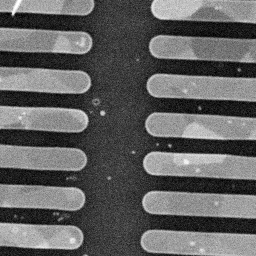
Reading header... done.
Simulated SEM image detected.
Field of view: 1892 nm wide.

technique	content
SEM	groups of lines, slits or small figures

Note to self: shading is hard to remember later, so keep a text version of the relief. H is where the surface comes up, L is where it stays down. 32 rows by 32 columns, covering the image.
HHHHHHHHHHHHLLLLLLLHHHHHHHHHHHHH
LHLLHHHHHHHLLLLLLLLHHHHHHHHHHHHH
LLLLLLLLLLLLLLLLLLLLLLLLHHHHHHHH
LLLLLLLLLLLLLLLLLLLLLLLLLLLLLLLL
HHHHHHHHHHHLLLLLLLLLLLLLLLLLLLLL
HHHHHHHHHHHLLLLLLLLHHHHHHHHHHHHH
LLLLLLLLHHHLLLLLLLLHHHHHHHHHHHHH
LLLLLLLLLLLLLLLLLLLLLLLLLLHHHHHH
HHLLLLLLLLLLLLLLLLLLLLLLLLLLLLLL
HHHHHHHHHHHLLLLLLLLHHHHLLLLLLLLL
HHHHHHHHHHHLLLLLLLHHHHHHHHHHHHHH
LLLLLLHHHHLLLLLLLLLHHHHHHHHHHHHH
LLLLLLLLLLLLLLLLLLLLLLLLLLLLLLHH
HHLLLLLLLLLLLLLLLLLLLLLLLLLLLLLL
HHHHHHHHHHHLLLLLLLLHHHHHHHHLLLLL
HHHHHHHHHHHLLLLLLLHHHHHHHHHHHHHH
LLLLLLLLLLLLLLLLLLLHHHHHHHHHHHHH
LLLLLLLLLLLLLLLLLLLLLLLLLLLLLLLL
HHHHHLLLLLLLLLLLLLLLLLLLLLLLLLLL
HHHHHHHHHHHLLLLLLLHHHHHHHHHHHHLL
HHHHHHHHHHHLLLLLLLHHHHHHHHHHHHHH
LLLLLLLLLLLLLLLLLLLHHHHHHHHHHHHH
LLLLLLLLLLLLLLLLLLLLLLLLLLLLLLLL
HHHHHHHHLLLLLLLLLLLLLLLLLLLLLLLL
HHHHHHHHHHLLLLLLLLHHHHHHHHHHHHHH
HHHHHHHHHHLLLLLLLLHHHHHHHHHHHHHH
LLLLLLLLLLLLLLLLLLLHHHHHHHHHHHHH
LLLLLLLLLLLLLLLLLLLLLLLLLLLLLLLL
HHHHHHHHHHLLLLLLLLLLLLLLLLLLLLLL
HHHHHHHHHHLLLLLLLLHHHHHHHHHHHHHH
HHHHHHHHHHLLLLLLLLHHHHHHHHHHHHHH
LLLLLLLLLLLLLLLLLLLLHHHHHHHHHHHH